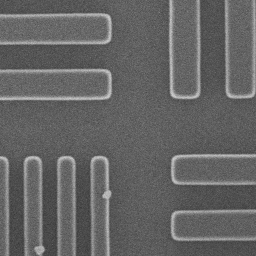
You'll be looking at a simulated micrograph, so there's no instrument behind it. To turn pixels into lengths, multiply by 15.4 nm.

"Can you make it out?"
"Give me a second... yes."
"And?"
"groups of lines, slits or small figures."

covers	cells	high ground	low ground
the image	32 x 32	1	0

00000000000000000000011110001111
00000000000000000000011110001111
11111111111111000000011110001111
11111111111111000000011110001111
11111111111111000000011110001111
00000000000000000000011110001111
00000000000000000000011110001111
00000000000000000000011110001111
00000000000000000000011110001111
11111111111111000000011110001111
11111111111111000000011110001111
11111111111111000000011110001111
00000000000000000000000000000000
00000000000000000000000000000000
00000000000000000000000000000000
00000000000000000000000000000000
00000000000000000000000000000000
00000000000000000000000000000000
00000000000000000000000000000000
00000000000000000000000000000001
10011001100110000000001111111111
10011001100110000000001111111111
10011001100110000000001111111111
10011001100111000000000000000000
10011001100111000000000000000000
10011001100110000000000000000000
10011001100110000000000011111111
10011001100110000000001111111111
10011001100110000000001111111111
10011001100110000000001111111111
10011001100110000000000000000000
10011001100110000000000000000000